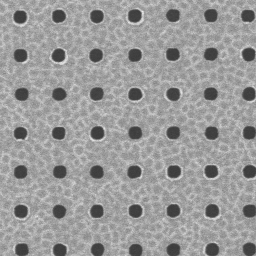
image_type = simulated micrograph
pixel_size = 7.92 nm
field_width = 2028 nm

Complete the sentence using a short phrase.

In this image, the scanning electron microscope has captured a regular array of holes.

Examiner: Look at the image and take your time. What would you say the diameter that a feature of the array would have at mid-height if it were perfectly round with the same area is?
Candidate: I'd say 110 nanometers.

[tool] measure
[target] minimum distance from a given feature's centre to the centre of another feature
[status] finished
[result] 0.3 um